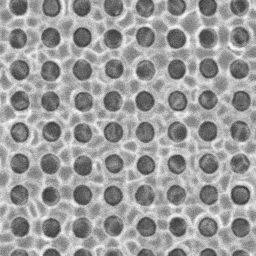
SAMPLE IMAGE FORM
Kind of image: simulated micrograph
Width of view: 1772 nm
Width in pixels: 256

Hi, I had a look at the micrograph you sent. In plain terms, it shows a regular array of holes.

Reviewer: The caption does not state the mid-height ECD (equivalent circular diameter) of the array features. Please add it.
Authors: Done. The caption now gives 141 nm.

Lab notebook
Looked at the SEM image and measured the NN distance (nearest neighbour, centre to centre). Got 212 nanometers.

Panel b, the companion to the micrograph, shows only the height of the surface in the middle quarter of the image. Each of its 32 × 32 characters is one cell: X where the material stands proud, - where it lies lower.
XX-----XXX-----XXX-----XXX----XX
XX-----XXX-----XXX-----XXX-----X
XX-----XXX-----XXX-----XXX----XX
XXX----XXXX---XXXXX---XXXXX---XX
XXXXXXXXXXXXXXXXXXXXXXXXXXXXXXXX
XXXXXXXXXXXXXXXXXXXXXXXXXXXXXXXX
XXXXXXXXXXXXXXXXXXXXXXXXXXXXXXXX
XXX----XXX----XXXX----XXXX----XX
XXX----XXX-----XXX-----XXX-----X
XXX-----XX-----XXX-----XXX-----X
XXX----XXX----XXXX-----XXX-----X
XXX----XXXX---XXXXX---XXXXX---XX
XXXXXXXXXXXXXXXXXXXXXXXXXXXXXXXX
XXXXXXXXXXXXXXXXXXXXXXXXXXXXXXXX
XXXXXXXXXXX--XXXXXX--XXXXXX--XXX
XXX---XXXX----XXXX----XXXX----XX
XX-----XXX-----XXX-----XXX-----X
XX-----XXX-----XXX-----XXX-----X
XXX----XXX-----XXX-----XXX-----X
XXX---XXXXX---XXXXX--XXXXXX--XXX
XXXXXXXXXXXXXXXXXXXXXXXXXXXXXXXX
XXXXXXXXXXXXXXXXXXXXXXXXXXXXXXXX
XXXXXXXXXXXX-XXXXXXXXXXXXXXX-XXX
XXX---XXXX----XXXXX---XXXX----XX
XX-----XXX-----XXX-----XXX----XX
XX-----XXX-----XXX-----XXX-----X
XX-----XXXX---XXXX-----XXX----XX
XXX----XXXXX-XXXXXX---XXXXXX-XXX
XXXXXXXXXXXXXXXXXXXXXXXXXXXXXXXX
XXXXXXXXXXXXXXXXXXXXXXXXXXXXXXXX
XXX---XXXXX--XXXXXX---XXXXX--XXX
XX-----XXX----XXXX----XXXX----XX